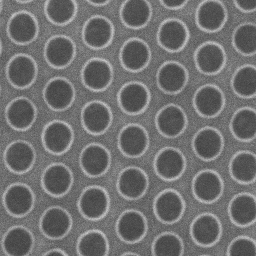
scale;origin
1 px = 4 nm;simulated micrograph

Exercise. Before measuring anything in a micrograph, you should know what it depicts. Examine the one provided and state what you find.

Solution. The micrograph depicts a regular array of raised bodies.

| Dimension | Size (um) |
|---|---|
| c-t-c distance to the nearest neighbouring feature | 0.17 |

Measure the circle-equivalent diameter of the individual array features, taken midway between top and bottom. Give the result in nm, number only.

128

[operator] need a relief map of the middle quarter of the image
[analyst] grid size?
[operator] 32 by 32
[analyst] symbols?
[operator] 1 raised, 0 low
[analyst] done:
10000111111100011111000011111100
00000111111100001110000011111100
00001111111100000000000111111110
00000111111100000000000111111110
10000111111100000100000111111110
11000111111000011111000011111100
11100001110000111111100011111000
11100000000000111111100000000000
11000000000000111111100000000000
11000001100000111111100000000000
10000111111000111111100001110000
00000111111100011111000011111100
00001111111100001000000111111100
00001111111100000000000111111100
00000111111100000000000111111110
10000111111000001110000111111100
11000011111000111111000011111100
11000001100000111111100011111000
11000000000000111111100000000000
11000000000000111111100000000000
10000011110000111111100000000000
10000111111000111111000001111000
00001111111000011111000111111000
00001111111100000000000111111100
00001111111000000000000111111100
00001111111000000000000111111100
10000111111000011110000111111100
11000011110000111111000111111000
11000000000000111111100011110000
11000000000001111111100000000000
11000000000001111111100000000000
10000111110000111111000001100000